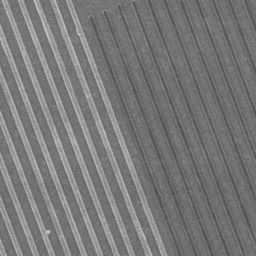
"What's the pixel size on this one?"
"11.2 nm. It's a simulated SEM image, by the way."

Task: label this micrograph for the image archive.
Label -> parallel lines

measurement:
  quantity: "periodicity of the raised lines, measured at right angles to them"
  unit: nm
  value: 169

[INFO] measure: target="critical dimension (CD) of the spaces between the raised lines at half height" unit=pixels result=10.3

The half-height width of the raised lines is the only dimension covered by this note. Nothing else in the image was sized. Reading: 51.3 nanometers